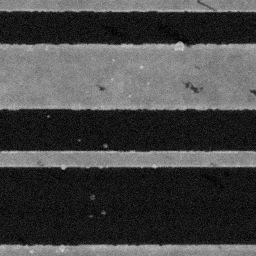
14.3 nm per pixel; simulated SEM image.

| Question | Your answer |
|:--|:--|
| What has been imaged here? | lines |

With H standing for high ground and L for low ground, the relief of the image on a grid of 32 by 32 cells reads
HHHHHHHHHHHHHHHHHHHHHHHHHHHHHHHH
LLLLLLLLLLLLLLLLLLLLLLLLLLLLLLLL
LLLLLLLLLLLLLLLLLLLLLLLLLLLLLLLL
LLLLLLLLLLLLLLLLLLLLLLLLLLLLLLLL
LLLLLLLLLLLLLLLLLLLLLLLLLLLLLLLL
LLLLLLLLLLLLLLLLLLLLLLHLLLLLLLLL
HHHHHHHHHHHHHHHHHHHHHHHHHHHHHHHH
HHHHHHHHHHHHHHHHHHHHHHHHHHHHHHHH
HHHHHHHHHHHHHHHHHHHHHHHHHHHHHHHH
HHHHHHHHHHHHHHHHHHHHHHHHHHHHHHHH
HHHHHHHHHHHHHHHHHHHHHHHHHHHHHHHH
HHHHHHHHHHHHHHHHHHHHHHHHHHHHHHHH
HHHHHHHHHHHHHHHHHHHHHHHHHHHHHHHH
HHLLLLLLLHLHHHLLHHLHHHHHHHHHHHHH
LLLLLLLLLLLLLLLLLLLLLLLLLLLLLLLL
LLLLLLLLLLLLLLLLLLLLLLLLLLLLLLLL
LLLLLLLLLLLLLLLLLLLLLLLLLLLLLLLL
LLLLLLLLLLLLLLLLLLLLLLLLLLLLLLLL
LLLLLLLLLLLLLLLLLLLLLLLLLLLLLLLL
HHHHHHHHHHHHHHHHHHHHHHHHHHHHHHHH
HHHHHHHHHHHHHHHHHHHHHHHHHHHHHHHH
LLLLLLLLLLLLLLLLLLLLLLLLLLLLLLLL
LLLLLLLLLLLLLLLLLLLLLLLLLLLLLLLL
LLLLLLLLLLLLLLLLLLLLLLLLLLLLLLLL
LLLLLLLLLLLLLLLLLLLLLLLLLLLLLLLL
LLLLLLLLLLLLLLLLLLLLLLLLLLLLLLLL
LLLLLLLLLLLLLLLLLLLLLLLLLLLLLLLL
LLLLLLLLLLLLLLLLLLLLLLLLLLLLLLLL
LLLLLLLLLLLLLLLLLLLLLLLLLLLLLLLL
LLLLLLLLLLLLLLLLLLLLLLLLLLLLLLLL
LLLLLLLLLLLLLLLLLLLLLLLLLLLLLLLL
HHHHHHHHHHHHHHHHHHHHHHHHHHHHHHHH